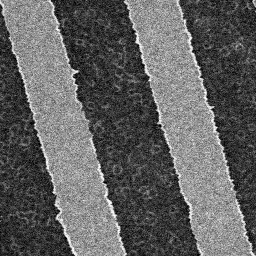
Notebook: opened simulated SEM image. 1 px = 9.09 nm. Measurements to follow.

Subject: one or a few lines or trenches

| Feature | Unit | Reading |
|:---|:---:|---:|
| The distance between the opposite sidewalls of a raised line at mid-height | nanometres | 454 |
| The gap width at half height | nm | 655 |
